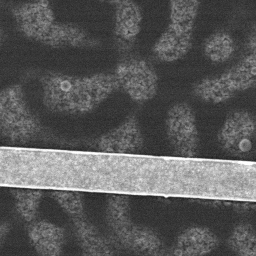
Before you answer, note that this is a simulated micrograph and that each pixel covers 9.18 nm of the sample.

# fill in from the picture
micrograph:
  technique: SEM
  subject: one or a few lines or trenches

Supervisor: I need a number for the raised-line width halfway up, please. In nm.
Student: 352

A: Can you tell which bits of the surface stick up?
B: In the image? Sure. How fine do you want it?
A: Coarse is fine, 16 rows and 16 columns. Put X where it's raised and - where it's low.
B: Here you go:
----------------
----------------
----------------
----------------
----------------
----------------
----------------
----------------
----------------
XXXXX-----------
XXXXXXXXXXXXXXXX
XXXXXXXXXXXXXXXX
---------------X
----------------
----------------
----------------